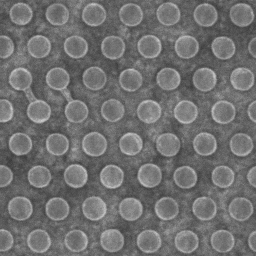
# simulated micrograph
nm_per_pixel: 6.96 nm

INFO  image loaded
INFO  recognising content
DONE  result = a regular array of raised bodies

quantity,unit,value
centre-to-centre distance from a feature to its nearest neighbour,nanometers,253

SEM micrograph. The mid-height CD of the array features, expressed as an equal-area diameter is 158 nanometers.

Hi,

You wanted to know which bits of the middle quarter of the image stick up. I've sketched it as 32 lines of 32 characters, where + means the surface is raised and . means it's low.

................................
......+++.......+........++.....
+....+++++....+++++.....+++++...
+....+++++....+++++....++++++...
+....+++++....+++++.....+++++...
+.....++++....+++++.....++++....
+...............++..............
+...............................
.+..............................
.+++......++++......+++......+++
.++++.....+++++....+++++....++++
++++++....+++++...++++++....++++
++++++....+++++....+++++....++++
.+++++....++++.....++++.....++++
....................++.......+++
................................
................................
......+++.......++..............
+....+++++....+++++.....++++....
+....+++++....+++++....++++++...
+....+++++....+++++....++++++...
+....+++++....+++++....++++++...
......+++.......++.......+++....
................................
................................
..++................+++.........
.++++.....++++.....+++++....++++
++++++...++++++....+++++....++++
++++++...++++++....+++++....++++
.++++.....++++.....+++++....++++
..++.......+++......+++......+++
................................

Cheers